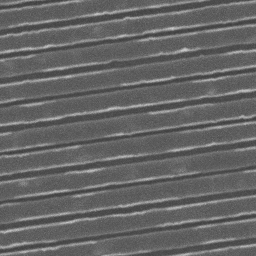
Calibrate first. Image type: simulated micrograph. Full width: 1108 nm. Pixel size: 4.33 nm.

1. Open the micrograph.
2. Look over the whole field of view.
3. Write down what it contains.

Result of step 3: parallel lines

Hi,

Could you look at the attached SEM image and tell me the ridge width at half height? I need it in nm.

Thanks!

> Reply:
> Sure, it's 79.9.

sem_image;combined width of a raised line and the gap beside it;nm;104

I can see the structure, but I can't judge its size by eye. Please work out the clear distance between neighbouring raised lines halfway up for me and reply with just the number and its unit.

26.2 nm